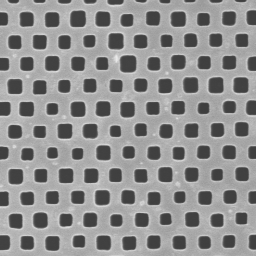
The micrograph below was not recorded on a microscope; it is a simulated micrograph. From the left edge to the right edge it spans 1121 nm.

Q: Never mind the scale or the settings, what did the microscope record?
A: a regular array of holes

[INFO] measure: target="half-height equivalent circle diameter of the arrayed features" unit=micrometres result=0.0632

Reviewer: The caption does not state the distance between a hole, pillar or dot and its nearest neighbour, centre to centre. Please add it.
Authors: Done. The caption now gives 108 nm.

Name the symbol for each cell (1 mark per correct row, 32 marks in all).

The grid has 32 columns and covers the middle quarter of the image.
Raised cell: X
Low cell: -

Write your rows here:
XX---XXX---XXX----XXX---XXX---XX
XXX--XXXX-XXXX----XXXX-XXXXXXXXX
XXXXXXXXXXXXXXXXXXXXXXXXXXXXXXXX
XXXXXXXXXXXXXXXXXX--XXXXXXXXXX--
-XXXX---XXX---XXXX---XX----XXX--
--XXX---XXX----XXX---XX----XXX--
-XXXX---XXX----XXX---XXX---XXX--
XXXXXXXXXXXXXXXXXXXXXXXXXXXXXXXX
XXXXXXXXXXXXXXXXXXXXXXXXXXXXXXXX
XX---XXXX--XXXX--XXXX--XXXX---XX
XX---XXX----XX----XXX---XXX---XX
XX---XXX----XX----XXX---XXX---XX
XX---XXX----XX----XXX---XXX---XX
XXXXXXXXXXXXXXXXXXXXXXXXXXXXXXXX
XXXXXXXXXXXXXXXXXXXXXXXXXXXXXXXX
--XXX---XXXX--XXXX---XXX---XXX--
--XXX---XXX---XXXX---XXX---XXX--
--XXX---XXXX--XXXX---XXX---XXX--
--XXX---XXXXXXXXXXXXXXXXX-XXXXXX
XXXXXXXXXXXXXXXXXXXXXXXXXXXXXXXX
XXXXXXXXX--XXXXXXXXXXXXXXXXXXXXX
XX---XXX----XXX---XXX---XXX---XX
XX---XXX----XXX---XXX---XXX---XX
XX---XXX----XXX--XXXX---XXX---XX
XXXXXXXXXXXXXXXXXXXXXXXXXXXXXXXX
XXXXXXXXXXXXXXXXXXXXXXXXXXXXXXXX
--XXX---XXX---XXXX--XXXX---XXX--
--XXX----XX----XX----XX----XXX--
--XXX----XX----XX----XX----XXX--
--XXX---XXXX--XXXX--XXXX--XXXXX-
XXXXXXXXXXXXXXXXXXXXXXXXXXXXXXXX
XXXXXXXXXXXXXXXXXXXXXXXXXXXXXXXX